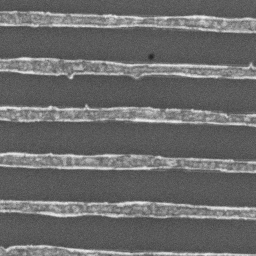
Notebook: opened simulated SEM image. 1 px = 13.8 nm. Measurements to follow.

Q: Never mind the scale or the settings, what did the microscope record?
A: parallel lines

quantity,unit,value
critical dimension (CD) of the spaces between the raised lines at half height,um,0.479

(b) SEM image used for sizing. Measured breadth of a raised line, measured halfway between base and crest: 0.169 micrometres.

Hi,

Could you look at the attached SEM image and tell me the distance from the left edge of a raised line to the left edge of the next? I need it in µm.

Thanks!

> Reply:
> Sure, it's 0.648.